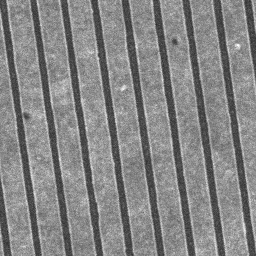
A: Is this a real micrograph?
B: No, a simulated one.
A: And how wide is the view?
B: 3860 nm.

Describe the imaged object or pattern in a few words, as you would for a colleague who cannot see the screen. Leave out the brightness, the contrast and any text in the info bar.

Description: parallel lines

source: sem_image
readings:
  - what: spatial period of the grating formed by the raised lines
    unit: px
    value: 30.3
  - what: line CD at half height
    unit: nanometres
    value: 342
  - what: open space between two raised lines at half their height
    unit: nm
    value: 119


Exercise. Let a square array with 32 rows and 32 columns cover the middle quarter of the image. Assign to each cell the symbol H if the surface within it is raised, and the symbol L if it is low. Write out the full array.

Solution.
HLLHHHHHHLLHHHHHLLLHHHHHLLHHHHHH
HLLHHHHHHLLHHHHHHLLHHHHHLLLHHHHH
HLLLHHHHHLLHHHHHHLLHHHHHHLLHHHHH
HHLLHHHHHLLHHHHHHLLHHHHHHLLHHHHH
HHLLHHHHHLLLHHHHHLLHHHHHHLLHHHHH
HHLLHHHHHHLLHHHHHLLHHHHHHLLHHHHH
HHLLHHHHHHLLHHHHHLLLHHHHHLLHHHHH
HHLLHHHHHHLLHHHHHHLLHHHHHLLHHHHH
HHLLHHHHHHLLHHHHHHLLHHHHHLLLHHHH
HHLLHHHHHHLLHHHHHHLLHHHHHHLLHHHH
HHHLLHHHHHLLHHHHHHLLHHHHHHLLHHHH
HHHLLHHHHHLLLHHHHHLLHHHHHHLLHHHH
HHHLLHHHHHHLLHHHHHLLHHHHHHLLHHHH
HHHLLHHHHHHLLHHHHHLLLHHHHHLLHHHH
HHHLLHHHHHHLLHHHHHHLLHHHHHLLHHHH
HHHLLHHHHHHLLHHHHHHLLHHHHHLLHHHH
HHHHLLHHHHHLLHHHHHHLLHHHHHHLLHHH
HHHHLLHHHHHLLHHHHHHLLHHHHHHLLHHH
HHHHLLHHHHHHLLHHHHHLLHHHHHHLLHHH
HHHHLLHHHHHHLLHHHHHLLHHHHHHLLHHH
HHHHLLHHHHHHLLHHHHHLLHHHHHHLLHHH
HHHHLLHHHHHHLLHHHHHHLLHHHHHLLHHH
HHHHLLHHHHHHLLHHHHHHLLHHHHHLLHHH
HHHHLLLHHHHHLLHHHHHHLLHHHHHLLLHH
HHHHHLLHHHHHLLHHHHHHLLHHHHHHLLHH
HHHHHLLHHHHHHLHHHHHHLLHHHHHHLLHH
HHHHHLLHHHHHHLLHHHHHLLHHHHHHLLHH
HHHHHLLHHHHHHLLHHHHHLLHHHHHHLLHH
HHHHHLLHHHHHHLLHHHHHLLLHHHHHLLHH
HHHHHLLHHHHHHLLHHHHHHLLHHHHHLLHH
HHHHHLLHHHHHHLLHHHHHHLLHHHHHLLLH
HHHHHHLLHHHHHLLHHHHHHLLHHHHHHLLH